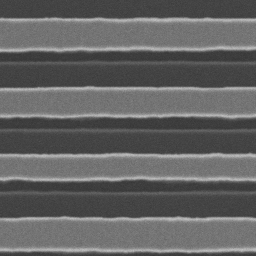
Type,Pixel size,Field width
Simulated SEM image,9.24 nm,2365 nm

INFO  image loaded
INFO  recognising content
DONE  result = lines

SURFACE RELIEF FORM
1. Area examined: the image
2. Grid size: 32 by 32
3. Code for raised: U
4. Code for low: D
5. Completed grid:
DDDDDDDDDDDDDDDDDDDDDDDDDDDDDDDD
DDDDDDDDDDDDDDDDDDDDDDDDDDDDDDDD
UUUUUUUUUUUUUUUUUUUUUUUUUUUUUUUU
UUUUUUUUUUUUUUUUUUUUUUUUUUUUUUUU
UUUUUUUUUUUUUUUUUUUUUUUUUUUUUUUU
UUUUUUUUUUUUUUUUUUUUUUUUUUUUUUUU
DDDDDDDDDDDDDDDDDDDDDDDDDDDDDDDD
DDDDDDDDDDDDDDDDDDDDDDDDDDDDDDDD
DDDDDDDDDDDDDDDDDDDDDDDDDDDDDDDD
DDDDDDDDDDDDDDDDDDDDDDDDDDDDDDDD
DDDDDDDDDDDDDDDDDDDDDDDDDDDDDDDD
UUUUUUUUUUUUUUUUUUUUUUUUUUUUUUUU
UUUUUUUUUUUUUUUUUUUUUUUUUUUUUUUU
UUUUUUUUUUUUUUUUUUUUUUUUUUUUUUUU
UUUUUUUUUUUUUUUUUUUUUUUUUUUUUUUU
DDDDDDDDDDDDDDDDDDDDDDDDDDDDDDDD
DDDDDDDDDDDDDDDDDDDDDDDDDDDDDDDD
DDDDDDDDDDDDDDDDDDDDDDDDDDDDDDDD
DDDDDDDDDDDDDDDDDDDDDDDDDDDDDDDD
UUUUUUUUUUUUUUUUUUUUUUUUUUUUUUUU
UUUUUUUUUUUUUUUUUUUUUUUUUUUUUUUU
UUUUUUUUUUUUUUUUUUUUUUUUUUUUUUUU
UDDDUUUUUUUUDUUDDDDDDDDUUUUUUUUU
DDDDDDDDDDDDDDDDDDDDDDDDDDDDDDDD
DDDDDDDDDDDDDDDDDDDDDDDDDDDDDDDD
DDDDDDDDDDDDDDDDDDDDDDDDDDDDDDDD
DDDDDDDDDDDDDDDDDDDDDDDDDDDDDDDD
UUUUUUUUUUUUUUUUUUUUUUUUUUUUUUUU
UUUUUUUUUUUUUUUUUUUUUUUUUUUUUUUU
UUUUUUUUUUUUUUUUUUUUUUUUUUUUUUUU
UUUUUUUUUUUUUUUUUUUUUUUUUUUUUUUU
DDDDDDDDDDDDDDDUDDDUDDDUUDDDDDDD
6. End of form